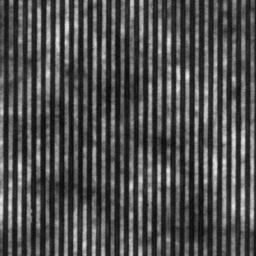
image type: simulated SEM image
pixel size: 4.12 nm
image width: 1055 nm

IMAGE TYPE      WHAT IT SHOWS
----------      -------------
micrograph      parallel lines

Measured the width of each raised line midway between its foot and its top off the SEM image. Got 17 nm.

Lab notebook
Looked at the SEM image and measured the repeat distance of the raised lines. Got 38.3 nanometers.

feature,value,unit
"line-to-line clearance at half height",21.1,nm